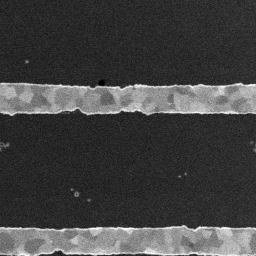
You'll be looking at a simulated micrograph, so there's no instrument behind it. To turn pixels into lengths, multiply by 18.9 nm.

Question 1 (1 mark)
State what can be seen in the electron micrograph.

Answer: one or a few lines or trenches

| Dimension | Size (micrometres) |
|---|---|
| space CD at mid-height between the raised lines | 2.17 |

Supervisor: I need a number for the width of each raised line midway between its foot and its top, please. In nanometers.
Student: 500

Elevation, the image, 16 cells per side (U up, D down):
DDDDDDDDDDDDDDDD
DDDDDDDDDDDDDDDD
DDDDDDDDDDDDDDDD
DDDDDDDDDDDDDDDD
DDDDDDDDDDDDDDDD
UUUUUUUUUUUUUUUU
UUUUUUUUUUUUUUUU
DDDDDDDDDDDDDDDD
DDDDDDDDDDDDDDDD
DDDDDDDDDDDDDDDD
DDDDDDDDDDDDDDDD
DDDDDDDDDDDDDDDD
DDDDDDDDDDDDDDDD
DDDDDDDDDDDDDDDD
UUUUUUUUUUUUUUUU
UUUUUUUUUUUUUUUU